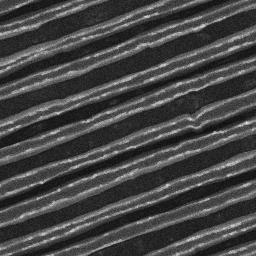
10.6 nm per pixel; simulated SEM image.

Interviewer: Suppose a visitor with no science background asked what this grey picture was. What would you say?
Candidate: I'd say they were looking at parallel lines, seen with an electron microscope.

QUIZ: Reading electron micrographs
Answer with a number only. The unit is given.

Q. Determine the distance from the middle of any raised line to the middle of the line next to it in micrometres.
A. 0.309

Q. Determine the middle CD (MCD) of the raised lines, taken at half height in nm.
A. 136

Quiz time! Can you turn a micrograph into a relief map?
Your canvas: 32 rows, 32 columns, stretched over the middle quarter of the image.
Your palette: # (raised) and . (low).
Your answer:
########................########
#######..............#########..
###...............#########.....
...............##########.......
.............#########.......###
..........########........######
.......#########........########
....########..........########..
.########..........#########....
#######..........########.......
####..........#########.........
##.........#########............
........########................
.......#######................##
....########...............#####
#########................#######
#######..............#########..
####..............##########....
##..............#########.......
..............########.......###
...........########.........####
........########........########
.....#########........#########.
...########........##########...
########........###########.....
#####........###########........
##........###########...........
........##########..............
....###########...............##
..###########..............#####
##########...............#######
########...............########.